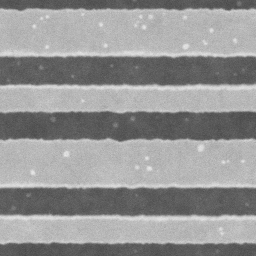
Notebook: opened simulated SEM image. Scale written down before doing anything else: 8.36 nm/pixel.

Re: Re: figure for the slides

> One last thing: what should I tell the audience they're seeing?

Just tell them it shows lines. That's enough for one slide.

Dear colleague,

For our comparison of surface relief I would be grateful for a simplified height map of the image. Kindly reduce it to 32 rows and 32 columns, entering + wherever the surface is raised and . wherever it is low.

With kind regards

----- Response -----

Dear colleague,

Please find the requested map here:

................................
++++++++++++++++++++++++++++++++
++++++++++++++++++++++++++++++++
++++++++++++++++++++++++++++++++
++++++++++++++++++++++++++++++++
++++++++++++++++++++++++++++++++
++++++++++++++++++++++++++++++++
................................
................................
................................
................................
++++++++++++++++++++++++++++++++
++++++++++++++++++++++++++++++++
++++++++++++++++++++++++++++++++
................................
................................
................................
.+++++.+..++.+...+++...+......++
++++++++++++++++++++++++++++++++
++++++++++++++++++++++++++++++++
++++++++++++++++++++++++++++++++
++++++++++++++++++++++++++++++++
++++++++++++++++++++++++++++++++
........+++.....+..+............
................................
................................
................................
++++++++++++++++++++++++++++++++
++++++++++++++++++++++++++++++++
++++++++++++++++++++++++++++++++
................................
................................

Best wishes